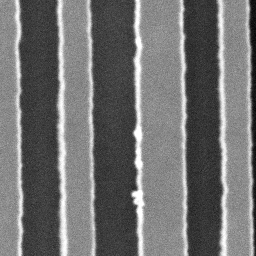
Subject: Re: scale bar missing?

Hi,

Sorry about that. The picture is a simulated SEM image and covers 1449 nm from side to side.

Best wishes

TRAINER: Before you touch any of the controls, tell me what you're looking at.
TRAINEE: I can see lines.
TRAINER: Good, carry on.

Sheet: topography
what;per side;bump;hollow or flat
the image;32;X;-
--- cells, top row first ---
XX------XXX------XXXXXX-----XXX-
XX-----XXXX------XXXXXX-----XXX-
XX------XXX------XXXXXX-----XXX-
XX------XXX------XXXXXX-----XXX-
XX------XXX------XXXXXX-----XXX-
XX------XXX------XXXXXX-----XXX-
XX------XXX------XXXXXX-----XXX-
XX------XXX------XXXXXX-----XXX-
XX------XXX------XXXXXX-----XXX-
XX------XXX------XXXXXX-----XXX-
XX------XXX------XXXXXX-----XXX-
XX------XXX------XXXXXX-----XXX-
XX------XXX------XXXXXX-----XXX-
XX------XXX------XXXXXX-----XXX-
XX------XXX------XXXXXX-----XXX-
XX------XXX------XXXXXX-----XXX-
XXX-----XXXX-----XXXXXX-----XXX-
XX------XXXX-----XXXXXX-----XXX-
XX------XXXX-----XXXXXX-----XXX-
XX------XXXX-----XXXXXX-----XXX-
XXX-----XXXX-----XXXXXX-----XXX-
XXX-----XXXX-----XXXXXX-----XXX-
XXX-----XXXX-----XXXXXX-----XXX-
XXX-----XXXX-----XXXXXX-----XXX-
XXX-----XXXX-----XXXXXX-----XXX-
XXX-----XXXX-----XXXXXX-----XXX-
XXX-----XXXX-----XXXXXX-----XXX-
XXX-----XXXX-----XXXXXX-----XXX-
XXX-----XXXX-----XXXXXX-----XXXX
XXX-----XXXX-----XXXXXX-----XXXX
XXX-----XXXX------XXXXX-----XXXX
XXX-----XXXX------XXXXX-----XXXX